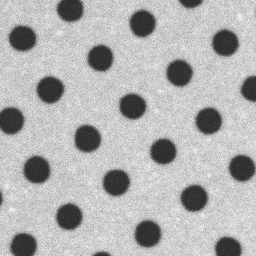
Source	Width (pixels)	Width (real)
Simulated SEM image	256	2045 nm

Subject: a regular array of holes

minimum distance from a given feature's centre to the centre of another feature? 438 nm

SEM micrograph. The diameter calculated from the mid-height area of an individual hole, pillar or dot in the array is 26.7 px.